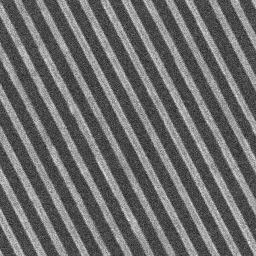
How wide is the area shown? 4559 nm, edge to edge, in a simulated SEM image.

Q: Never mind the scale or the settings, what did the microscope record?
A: parallel lines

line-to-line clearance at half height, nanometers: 233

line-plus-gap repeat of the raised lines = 0.341 µm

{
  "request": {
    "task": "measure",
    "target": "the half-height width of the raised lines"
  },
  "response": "109 nm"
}